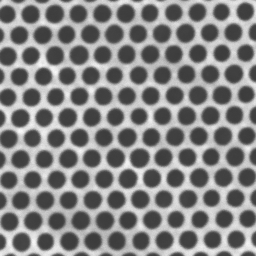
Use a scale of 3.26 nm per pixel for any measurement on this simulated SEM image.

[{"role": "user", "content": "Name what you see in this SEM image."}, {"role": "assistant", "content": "a regular array of holes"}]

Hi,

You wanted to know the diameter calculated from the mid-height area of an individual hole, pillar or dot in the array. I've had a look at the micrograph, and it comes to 0.0605 µm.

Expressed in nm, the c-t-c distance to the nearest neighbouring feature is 76.7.